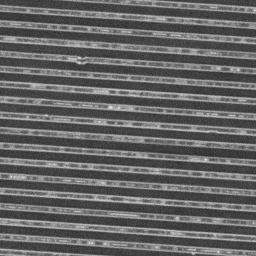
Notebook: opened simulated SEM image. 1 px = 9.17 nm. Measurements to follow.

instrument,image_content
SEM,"parallel lines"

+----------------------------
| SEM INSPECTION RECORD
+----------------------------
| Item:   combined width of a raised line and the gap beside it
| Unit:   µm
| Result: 0.139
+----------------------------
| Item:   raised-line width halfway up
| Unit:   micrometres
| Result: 0.0503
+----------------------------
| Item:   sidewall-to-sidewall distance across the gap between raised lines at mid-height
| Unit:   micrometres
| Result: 0.0926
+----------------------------